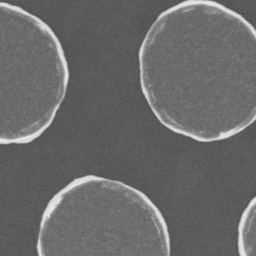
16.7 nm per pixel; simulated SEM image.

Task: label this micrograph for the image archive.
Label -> raised bodies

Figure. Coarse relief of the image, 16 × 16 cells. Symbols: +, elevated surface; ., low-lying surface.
+..........+++..
+++.......+++++.
+++......+++++++
++++.....+++++++
++++.....+++++++
++++.....+++++++
++++.....+++++++
+++.......++++++
++..........++..
................
................
.....+++........
...++++++.......
...+++++++.....+
..++++++++.....+
..+++++++++....+